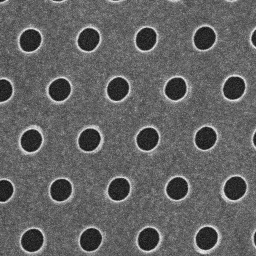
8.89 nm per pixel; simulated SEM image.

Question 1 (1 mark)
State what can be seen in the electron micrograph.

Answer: a regular array of holes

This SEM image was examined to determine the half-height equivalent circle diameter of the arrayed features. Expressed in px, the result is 23.2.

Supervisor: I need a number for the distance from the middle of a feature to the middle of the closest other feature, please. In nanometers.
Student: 512